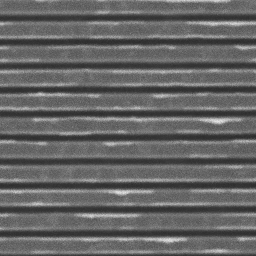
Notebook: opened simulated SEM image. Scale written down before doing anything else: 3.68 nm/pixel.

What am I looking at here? parallel lines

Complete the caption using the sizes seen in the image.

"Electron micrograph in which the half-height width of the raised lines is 59.9 nm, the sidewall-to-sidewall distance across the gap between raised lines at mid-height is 28.1 nm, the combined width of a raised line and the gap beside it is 88.3 nm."